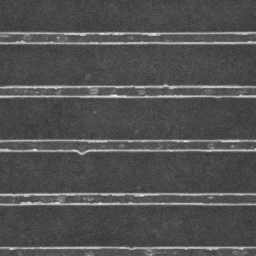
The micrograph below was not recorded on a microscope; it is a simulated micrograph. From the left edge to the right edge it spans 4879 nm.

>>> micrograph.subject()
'parallel lines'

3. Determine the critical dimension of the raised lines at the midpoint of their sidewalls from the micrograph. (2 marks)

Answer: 195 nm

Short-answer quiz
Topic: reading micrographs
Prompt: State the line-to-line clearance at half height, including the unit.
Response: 836 nm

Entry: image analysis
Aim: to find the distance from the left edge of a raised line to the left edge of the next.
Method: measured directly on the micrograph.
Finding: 1020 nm